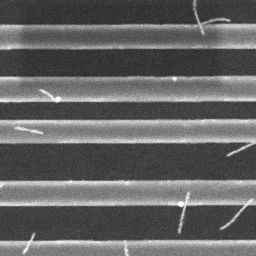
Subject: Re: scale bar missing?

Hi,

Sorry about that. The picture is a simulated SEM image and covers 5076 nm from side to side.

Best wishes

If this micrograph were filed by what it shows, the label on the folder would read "lines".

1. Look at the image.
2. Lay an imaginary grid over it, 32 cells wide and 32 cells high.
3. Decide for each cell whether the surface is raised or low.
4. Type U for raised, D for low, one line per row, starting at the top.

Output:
DDDDDDDDDDDDDDDDDDDDDDDDDDDDDDDD
DDDDDDDDDDDDDDDDDDDDDDDDDDDDDDDD
DDDDDDDDDDDDDDDDDDDDDDDDDDDDDDDD
UUUUUUUUUUUUUUUUUUUUUUUUUUUUUUUU
UUUUUUUUUUUUUUUUUUUUUUUUUUUUUUUU
UUUUUUUUUUUUUUUUUUUUUUUUUUUUUUUU
DDDDDDDDDDDDDDDDDDDDDDDDDDDDDDDD
DDDDDDDDDDDDDDDDDDDDDDDDDDDDDDDD
DDDDDDDDDDDDDDDDDDDDDDDDDDDDDDDD
DDDDDDDDDDDDDDDDDDDDDDDDDDDDDDDD
UUUUUUUUUUUUUUUUUUUUUUUUUUUUUUUU
UUUUUUUUUUUUUUUUUUUUUUUUUUUUUUUU
UUUUUUUUUUUUUUUDDDDDDDUUUDDDUUUU
DDDDDDDDDDDDDDDDDDDDDDDDDDDDDDDD
DDDDDDDDDDDDDDDDDDDDDDDDDDDDDDDD
UUUUUUUUUUUUUUUUUUUUUUUUUUUUUUUU
UUUUUUUUUUUUUUUUUUUUUUUUUUUUUUUU
UUUUUUUUUUUUUUUUUUUUUUUUUUUUUUUU
DDDDDDDDDDDDDDDDDDDDDDDDDDDDDDDD
DDDDDDDDDDDDDDDDDDDDDDDDDDDDDDDD
DDDDDDDDDDDDDDDDDDDDDDDDDDDDDDDD
DDDDDDDDDDDDDDDDDDDDDDDDDDDDDDDD
DDDDDDDDDDDDDDDDDDDDDDDDDDDDDDDD
UUUUUUUUUUUUUUUUUUUUUUUUUUUUUUUU
UUUUUUUUUUUUUUUUUUUUUUUUUUUUUUUU
UUUUUUUUUUUUUUDDDDDDDUUUDDDDDDUD
DDDDDDDDDDDDDDDDDDDDDDDDDDDDDDDD
DDDDDDDDDDDDDDDDDDDDDDDDDDDDDDDD
DDDDDDDDDDDDDDDDDDDDDDDDDDDDDDDD
DDDDDDDDDDDDDDDDDDDDDDDDDDDDDDDD
UUUUUUUUUUUUUUUUUUUUUUUUUUUUUUUU
UUUUUUUUUUUUUUUUUUUUUUUUUUUUUUUU